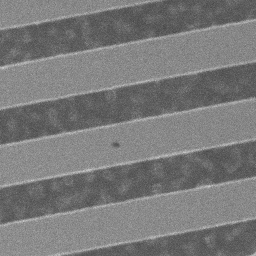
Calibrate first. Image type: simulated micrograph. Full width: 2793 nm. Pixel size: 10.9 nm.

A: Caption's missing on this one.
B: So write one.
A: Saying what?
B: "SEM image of one or a few lines or trenches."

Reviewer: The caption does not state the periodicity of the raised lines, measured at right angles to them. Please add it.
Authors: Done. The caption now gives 845 nm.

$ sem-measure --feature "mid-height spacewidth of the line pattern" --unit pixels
39.5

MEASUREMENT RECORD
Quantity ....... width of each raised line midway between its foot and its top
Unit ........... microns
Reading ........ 0.412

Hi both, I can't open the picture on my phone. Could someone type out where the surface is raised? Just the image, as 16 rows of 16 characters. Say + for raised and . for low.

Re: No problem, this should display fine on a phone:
.......+++++++++
..+++++++++++++.
+++++++++.......
++++............
............++++
.......+++++++++
..++++++++++++..
+++++++++.......
++++............
............++++
......++++++++++
.+++++++++++++..
+++++++++.......
+++.............
...........+++++
......++++++++++